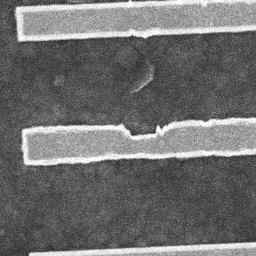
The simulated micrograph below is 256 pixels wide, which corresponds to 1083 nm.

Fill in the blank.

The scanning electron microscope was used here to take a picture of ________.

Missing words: one or a few lines or trenches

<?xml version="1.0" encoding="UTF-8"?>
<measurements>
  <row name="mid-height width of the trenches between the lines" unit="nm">388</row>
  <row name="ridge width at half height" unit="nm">128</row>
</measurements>